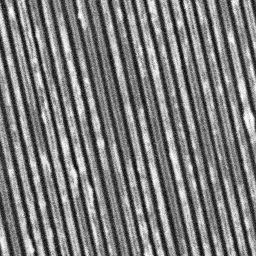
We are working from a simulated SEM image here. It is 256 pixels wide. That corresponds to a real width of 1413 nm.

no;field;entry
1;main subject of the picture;parallel lines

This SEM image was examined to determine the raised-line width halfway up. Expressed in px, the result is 5.36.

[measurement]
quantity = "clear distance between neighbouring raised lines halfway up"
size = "34.3 nm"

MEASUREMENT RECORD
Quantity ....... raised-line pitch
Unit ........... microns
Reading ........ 0.064